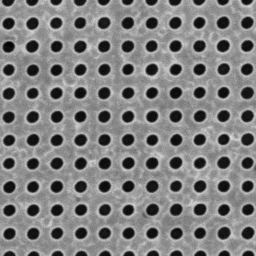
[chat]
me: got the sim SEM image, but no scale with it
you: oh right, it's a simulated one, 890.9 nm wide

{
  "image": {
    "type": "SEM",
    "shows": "a regular array of holes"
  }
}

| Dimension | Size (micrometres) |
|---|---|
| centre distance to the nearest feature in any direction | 0.0803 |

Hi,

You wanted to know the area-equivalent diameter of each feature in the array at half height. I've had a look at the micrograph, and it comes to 44.3 nanometres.